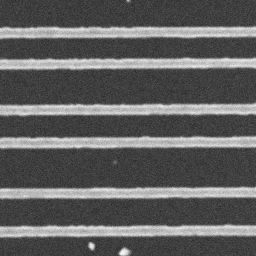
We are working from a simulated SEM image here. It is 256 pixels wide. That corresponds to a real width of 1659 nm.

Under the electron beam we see lines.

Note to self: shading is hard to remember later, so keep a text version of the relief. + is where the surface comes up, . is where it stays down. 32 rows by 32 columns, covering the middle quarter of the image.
++++++++++++++++++++++++++++++++
................................
................................
................................
................................
................................
................................
................................
................................
................................
++++++++++++++++++++++++++++++++
++++++++++++++++++++++++++++++++
++++++++++++.+.....++...........
................................
................................
................................
................................
................................
...................++...........
++++++++++++++++++++++++++++++++
+++++++++++++++++++++++++++++++.
................................
................................
................................
................................
................................
................................
................................
................................
................................
................................
++++++++++++++++++++++++++++++++